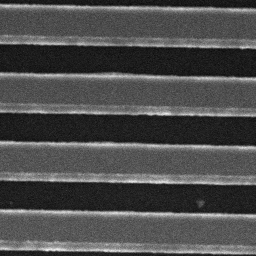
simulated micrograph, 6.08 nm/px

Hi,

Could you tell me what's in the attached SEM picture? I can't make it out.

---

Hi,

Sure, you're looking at lines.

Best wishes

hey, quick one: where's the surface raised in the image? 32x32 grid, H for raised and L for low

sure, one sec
LLLLLLLLLLLLLLLLLLLLLLLLLLLLLLLL
HHHHHHHHHHHHHHHHHHHHHHHHHHHHHHHH
HHHHHHHHHHHHHHHHHHHHHHHHHHHHHHHH
HHHHHHHHHHHHHHHHHHHHHHHHHHHHHHHH
HHHHHHHHHHHHHHHHHHHHHHHHHHHHHHHH
LLLLLHHHHHHHHHHHHHHHHHHHHHHHHHHH
LLLLLLLLLLLLLLLLLLLLLLLLLLLLLLLL
LLLLLLLLLLLLLLLLLLLLLLLLLLLLLLLL
LLLLLLLLLLLLLLLLLLLLLLLLLLLLLLLL
HHHHHHHHHHHHHHHHHHHLLLLLLLLLLLLL
HHHHHHHHHHHHHHHHHHHHHHHHHHHHHHHH
HHHHHHHHHHHHHHHHHHHHHHHHHHHHHHHH
HHHHHHHHHHHHHHHHHHHHHHHHHHHHHHHH
HHHHHHHHHHHHHHHHHHHHHHHHHHHHHHHH
LLLLLLLLLLLLLLLLLLLLLLLLLLLLLLLL
LLLLLLLLLLLLLLLLLLLLLLLLLLLLLLLL
LLLLLLLLLLLLLLLLLLLLLLLLLLLLLLLL
LLLLLLLLLLLLLLLLLLLLLLLLLLLLLLLL
HHHHHHHHHHHHHHHHHHHHHHHHHHHHHHHH
HHHHHHHHHHHHHHHHHHHHHHHHHHHHHHHH
HHHHHHHHHHHHHHHHHHHHHHHHHHHHHHHH
HHHHHHHHHHHHHHHHHHHHHHHHHHHHHHHH
LHHHHHHHHHHHHHHHHHHHHHHHHHHHHHHH
LLLLLLLLLLLLLLLLLLLLLLLLLLLLLLLL
LLLLLLLLLLLLLLLLLLLLLLLLLLLLLLLL
LLLLLLLLLLLLLLLLLLLLLLLLLLLLLLLL
HHHHHHHHHHHHHLLLLLLLLLLLLLLLLLLL
HHHHHHHHHHHHHHHHHHHHHHHHHHHHHHHH
HHHHHHHHHHHHHHHHHHHHHHHHHHHHHHHH
HHHHHHHHHHHHHHHHHHHHHHHHHHHHHHHH
HHHHHHHHHHHHHHHHHHHHHHHHHHHHHHHH
LLLLLLLLLLLLLLLLLLLHHHHHHHHHHHHH